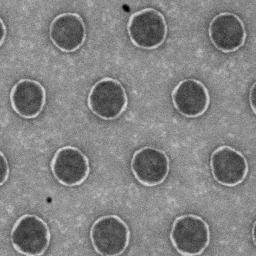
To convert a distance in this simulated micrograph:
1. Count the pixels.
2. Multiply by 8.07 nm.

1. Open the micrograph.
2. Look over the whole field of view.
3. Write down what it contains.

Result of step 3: a regular array of raised bodies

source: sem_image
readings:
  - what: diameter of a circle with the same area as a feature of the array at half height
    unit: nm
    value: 300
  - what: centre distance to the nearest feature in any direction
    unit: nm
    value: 623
